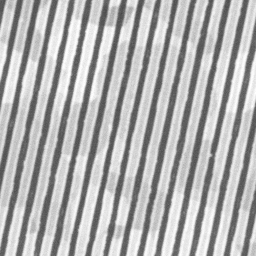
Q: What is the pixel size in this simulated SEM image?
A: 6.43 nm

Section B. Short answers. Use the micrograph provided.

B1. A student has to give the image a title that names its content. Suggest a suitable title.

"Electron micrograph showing parallel lines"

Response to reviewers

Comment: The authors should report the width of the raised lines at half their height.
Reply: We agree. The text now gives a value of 0.0512 um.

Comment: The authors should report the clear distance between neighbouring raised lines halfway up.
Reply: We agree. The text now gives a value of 0.0567 microns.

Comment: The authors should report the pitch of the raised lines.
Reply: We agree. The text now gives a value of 109 nanometres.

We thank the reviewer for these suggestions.